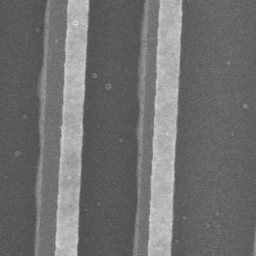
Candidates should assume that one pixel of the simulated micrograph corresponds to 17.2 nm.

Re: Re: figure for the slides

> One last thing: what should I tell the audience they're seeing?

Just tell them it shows lines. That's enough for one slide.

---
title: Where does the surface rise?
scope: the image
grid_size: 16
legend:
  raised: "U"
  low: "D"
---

DDDUUUDDDUUDDDDD
DDDUUDDDDUUDDDDD
DDDUUDDDDUUDDDDD
DDDUUDDDDUUDDDDD
DDDUUDDDDUUDDDDD
DDDUUDDDDUUDDDDD
DDDUUDDDDUUDDDDD
DDDUUDDDDUUDDDDD
DDDUUDDDDUUDDDDD
DDDUUDDDDUUDDDDD
DDDUUDDDDUUDDDDD
DDDUUDDDDUUDDDDD
DDUUUDDDDUUDDDDD
DDUUUDDDDUUDDDDD
DDUUUDDDDUUDDDDD
DDUUUDDDDUUDDDDD